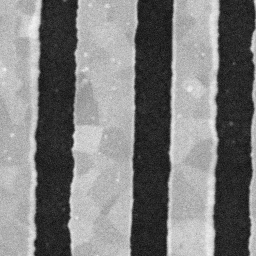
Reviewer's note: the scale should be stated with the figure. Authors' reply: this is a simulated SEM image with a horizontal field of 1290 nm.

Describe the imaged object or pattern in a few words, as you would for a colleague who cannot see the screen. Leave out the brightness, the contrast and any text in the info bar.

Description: lines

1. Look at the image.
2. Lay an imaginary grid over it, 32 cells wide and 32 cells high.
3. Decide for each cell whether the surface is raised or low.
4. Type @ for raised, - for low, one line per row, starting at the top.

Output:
@@@@@-----@@@@@@@-----@@@@@-----
@@@@@-----@@@@@@@-----@@@@@-----
@@@@@-----@@@@@@@-----@@@@@-----
@@@@@-----@@@@@@@-----@@@@@-----
@@@@@-----@@@@@@@-----@@@@@-----
@@@@@-----@@@@@@@-----@@@@@----@
@@@@@----@@@@@@@@-----@@@@@-----
@@@@@----@@@@@@@@-----@@@@@-----
@@@@@-----@@@@@@@-----@@@@@-----
@@@@@----@@@@@@@@-----@@@@@-----
@@@@@----@@@@@@@@-----@@@@@-----
@@@@@----@@@@@@@@-----@@@@@-----
@@@@@----@@@@@@@@-----@@@@@-----
@@@@@----@@@@@@@@-----@@@@@-----
@@@@@----@@@@@@@@-----@@@@@-----
@@@@@----@@@@@@@@----@@@@@@----@
@@@@-----@@@@@@@@----@@@@@@----@
@@@@-----@@@@@@@@----@@@@@@----@
@@@@-----@@@@@@@@----@@@@@@----@
@@@@-----@@@@@@@@----@@@@@@----@
@@@@-----@@@@@@@-----@@@@@@----@
@@@@-----@@@@@@@@----@@@@@@-----
@@@@-----@@@@@@@-----@@@@@@----@
@@@@-----@@@@@@@-----@@@@@@----@
@@@@-----@@@@@@@@----@@@@@@----@
@@@@-----@@@@@@@@----@@@@@@----@
@@@@-----@@@@@@@-----@@@@@@----@
@@@@-----@@@@@@@-----@@@@@@----@
@@@@-----@@@@@@@-----@@@@@@----@
@@@@-----@@@@@@@-----@@@@@@----@
@@@@-----@@@@@@@-----@@@@@@----@
@@@@-----@@@@@@@-----@@@@@@----@